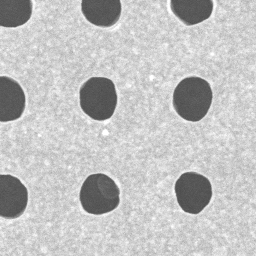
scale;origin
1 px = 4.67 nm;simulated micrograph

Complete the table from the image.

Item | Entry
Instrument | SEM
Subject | holes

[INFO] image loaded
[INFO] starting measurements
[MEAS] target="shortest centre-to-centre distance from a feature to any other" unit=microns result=0.438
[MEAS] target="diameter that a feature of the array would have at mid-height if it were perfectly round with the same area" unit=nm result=191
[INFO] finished